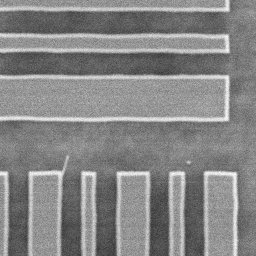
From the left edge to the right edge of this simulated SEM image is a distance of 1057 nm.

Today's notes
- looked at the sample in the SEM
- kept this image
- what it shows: groups of lines, slits or small figures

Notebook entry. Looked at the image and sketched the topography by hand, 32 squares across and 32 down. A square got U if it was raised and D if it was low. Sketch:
UUUUUUUUUUUUUUUUUUUUUUUUUUUUDDDD
DDDDDDDDDDDDDDDDDDDDDDDDDDDDDDDD
DDDDDDDDDDDDDDDDDDDDDDDDDDDDDDDD
DDDDDDDDDDDDDDDDDDDDDDDDDDDDDDDD
UUUUUDDUUUUUUDDDDUUUUUUUUUDDDDDD
UUUUUUUUUUUUUUUUUUUUUUUUUUUUDDDD
DDDDDDDDDDDDDDDDDDDDDDDDDDDDDDDD
DDDDDDDDDDDDDDDDDDDDDDDDDDDDDDDD
DDDDDDDDDDDDDDDDDDDDDDDDDDDDDDDD
DDDDDDDDDDDDDDDDDDDDDDDDDDDDDDDD
UUUUUUUUUUUUUUUUUUUUUUUUUUUUDDDD
UUUUUUUUUUUUUUUUUUUUUUUUUUUUDDDD
UUUUUUUUUUUUUUUUUUUUUUUUUUUUDDDD
UUUUUUUUUUUUUUUUUUUUUUUUUUUUDDDD
UUUUUUUUUUUUUUUUUUUUUUUUUUUUDDDD
DDDDDDDDDDDDDDDDDDDDDDDDDDDDDDDD
DDDDDDDDDDDDDDDDDDDDDDDDDDDDDDDD
DDDDDDDDDDDDDDDDDDDDDDDDDDDDDDDD
DDDDDDDDDDDDDDDDDDDDDDDDDDDDDDDD
DDDDDDDDDDDDDDDDDDDDDDDDDDDDDDDD
DDDDDDDDDDDDDDDDDDDDDDDDDDDDDDDD
DDDDDDDDDDDDDDDDDDDDDDDDDDDDDDDD
UDDDUUUUDDUUDDDUUUUDDUUDDDUUUDDD
UDDDUUUUDDUUDDDUUUUDDUUDDDUUUDDD
UDDDUUUUDDUUDDDUUUUDDUUDDDUUUUDD
UDDDUUUUDDUUDDDUUUUDDUUDDDUUUUDD
UDDDUUUDDDUUDDDUUUUDDUUDDDUUUUDD
UDDDUUUDDDUUDDDUUUUDDUUDDDUUUDDD
UDDDUUUDDDUUDDDUUUUDDUUDDDUUUDDD
UDDDUUUDDDUUDDDUUUUDDUUDDDUUUDDD
UDDDUUUDDDUUDDDUUUUDDUUDDDUUUDDD
UDDDUUUDDDUUDDDUUUDDDUUDDDUUUDDD